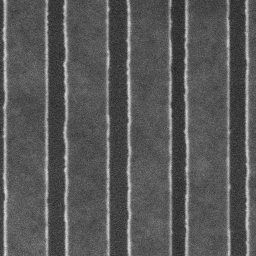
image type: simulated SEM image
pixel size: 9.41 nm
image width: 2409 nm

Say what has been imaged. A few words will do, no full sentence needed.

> lines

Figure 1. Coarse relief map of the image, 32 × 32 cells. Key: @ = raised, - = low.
-@@@@@--@@@@@---@@@@@--@@@@@@--@
-@@@@@--@@@@@@--@@@@@--@@@@@@--@
-@@@@@--@@@@@---@@@@@--@@@@@@--@
@@@@@@--@@@@@---@@@@@--@@@@@@--@
-@@@@@--@@@@@---@@@@@--@@@@@@--@
-@@@@@--@@@@@---@@@@@--@@@@@@--@
-@@@@@--@@@@@@--@@@@@--@@@@@@--@
-@@@@@--@@@@@@--@@@@@--@@@@@@--@
-@@@@@--@@@@@---@@@@@--@@@@@@--@
-@@@@@--@@@@@---@@@@@--@@@@@@--@
-@@@@@--@@@@@---@@@@@--@@@@@@--@
-@@@@@--@@@@@---@@@@@--@@@@@@--@
-@@@@@--@@@@@---@@@@@--@@@@@@--@
-@@@@@--@@@@@---@@@@@--@@@@@@--@
-@@@@@--@@@@@@--@@@@@--@@@@@@--@
-@@@@@--@@@@@@--@@@@@--@@@@@@--@
-@@@@@--@@@@@@--@@@@@--@@@@@@--@
-@@@@@--@@@@@@--@@@@@--@@@@@@--@
-@@@@@--@@@@@@--@@@@@--@@@@@@--@
-@@@@@--@@@@@@--@@@@@--@@@@@@--@
-@@@@@--@@@@@@--@@@@@--@@@@@@--@
-@@@@@--@@@@@@--@@@@@--@@@@@@--@
-@@@@@--@@@@@@--@@@@@--@@@@@@--@
-@@@@@--@@@@@@--@@@@@--@@@@@@--@
-@@@@@--@@@@@@--@@@@@--@@@@@@--@
-@@@@@--@@@@@@--@@@@@--@@@@@@--@
-@@@@@--@@@@@@--@@@@@--@@@@@@--@
-@@@@@--@@@@@@--@@@@@--@@@@@@--@
-@@@@@--@@@@@@--@@@@@--@@@@@@--@
-@@@@@--@@@@@@--@@@@@--@@@@@@--@
-@@@@@--@@@@@@--@@@@@--@@@@@@--@
-@@@@@--@@@@@@--@@@@@--@@@@@@--@